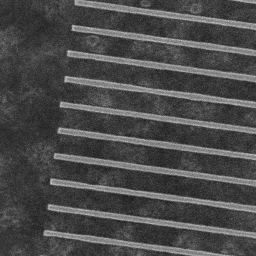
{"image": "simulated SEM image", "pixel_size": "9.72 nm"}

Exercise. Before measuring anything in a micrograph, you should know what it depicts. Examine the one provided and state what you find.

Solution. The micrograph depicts parallel lines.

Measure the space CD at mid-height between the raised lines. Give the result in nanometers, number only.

197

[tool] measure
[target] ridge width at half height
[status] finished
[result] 54.2 nm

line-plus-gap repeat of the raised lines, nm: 251